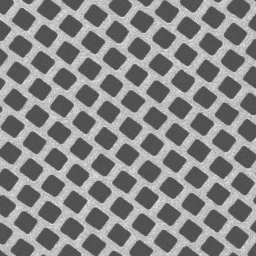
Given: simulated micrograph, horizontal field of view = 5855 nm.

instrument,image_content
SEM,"a regular array of holes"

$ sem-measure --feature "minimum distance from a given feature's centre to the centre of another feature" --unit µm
0.61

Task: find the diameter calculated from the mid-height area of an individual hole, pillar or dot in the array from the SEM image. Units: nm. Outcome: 475